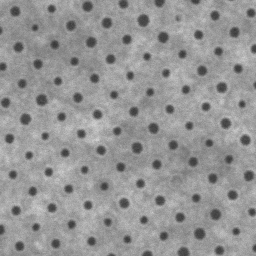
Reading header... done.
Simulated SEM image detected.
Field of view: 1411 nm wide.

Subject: a regular array of holes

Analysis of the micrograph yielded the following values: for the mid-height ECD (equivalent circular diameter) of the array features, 59.9 nanometres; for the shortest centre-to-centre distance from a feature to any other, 138 nanometers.